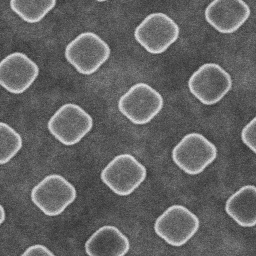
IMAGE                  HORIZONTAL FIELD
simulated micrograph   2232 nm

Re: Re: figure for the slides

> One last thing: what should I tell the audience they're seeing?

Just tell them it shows a regular array of raised bodies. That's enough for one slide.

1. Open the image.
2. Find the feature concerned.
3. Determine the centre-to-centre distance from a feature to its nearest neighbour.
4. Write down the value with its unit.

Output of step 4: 0.631 microns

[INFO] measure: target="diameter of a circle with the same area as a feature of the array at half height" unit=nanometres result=334